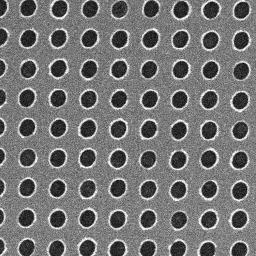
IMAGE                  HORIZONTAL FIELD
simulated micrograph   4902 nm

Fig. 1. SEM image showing a regular array of holes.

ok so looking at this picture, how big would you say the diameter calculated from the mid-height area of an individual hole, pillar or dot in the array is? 323 nm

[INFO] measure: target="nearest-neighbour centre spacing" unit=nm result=569